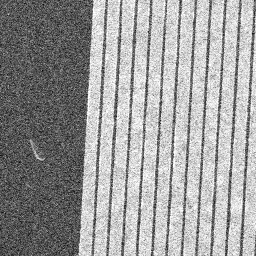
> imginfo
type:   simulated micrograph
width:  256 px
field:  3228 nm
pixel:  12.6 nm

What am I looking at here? parallel lines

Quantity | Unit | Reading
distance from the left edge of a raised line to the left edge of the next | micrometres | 0.187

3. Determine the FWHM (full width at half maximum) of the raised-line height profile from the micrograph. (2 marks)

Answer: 0.145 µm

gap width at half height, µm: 0.0409